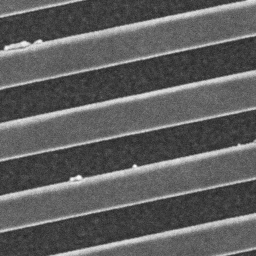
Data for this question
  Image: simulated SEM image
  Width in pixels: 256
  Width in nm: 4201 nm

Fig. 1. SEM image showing lines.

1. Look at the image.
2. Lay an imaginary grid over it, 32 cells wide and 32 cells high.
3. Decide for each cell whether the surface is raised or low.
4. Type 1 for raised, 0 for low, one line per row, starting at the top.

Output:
11111111000000000000000000000011
11100000000000000000000011111111
00000000000000000001111111111111
00000000000000011111111111111111
00000000001111111111111111111111
00100111111111111111111111100000
11111111111111111111110000000000
11111111111111111000000000000000
11111111111110000000000000000000
11111111000000000000000000000111
11100000000000000000000011111111
00000000000000000001111111111111
00000000000000011111111111111111
00000000001111111111111111111111
00000111111111111111111111110000
11111111111111111111111000000000
11111111111111111100000000000000
11111111111110000000000000000000
11111111000000000000000000000111
11100000000000000000000011111111
00000000000000000000111111111111
00000000000000011111111111111111
00000000011111111111111111111111
00000111111111111111111111100000
01111111111111111111110000000000
11111111111111111000000000000000
11111111111100000000000000000000
11111110000000000000000000001111
11100000000000000000000011111111
00000000000000000001111111111111
00000000000000111111111111111111
00000000011111111111111111111100